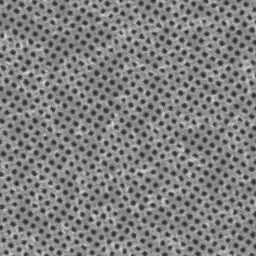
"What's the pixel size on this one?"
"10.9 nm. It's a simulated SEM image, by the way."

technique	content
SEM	a regular array of holes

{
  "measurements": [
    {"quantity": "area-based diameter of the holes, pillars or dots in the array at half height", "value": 64.1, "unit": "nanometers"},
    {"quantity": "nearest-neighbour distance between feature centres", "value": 94.6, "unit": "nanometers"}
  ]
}